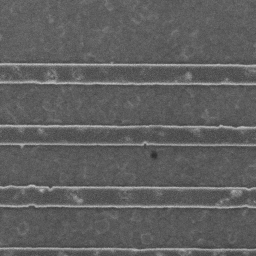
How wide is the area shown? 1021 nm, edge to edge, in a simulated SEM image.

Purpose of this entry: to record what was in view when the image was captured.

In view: one or a few lines or trenches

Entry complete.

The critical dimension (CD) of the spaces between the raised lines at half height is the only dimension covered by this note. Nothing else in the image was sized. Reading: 165 nm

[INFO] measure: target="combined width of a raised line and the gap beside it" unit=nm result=245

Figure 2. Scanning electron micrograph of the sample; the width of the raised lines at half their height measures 77.3 nm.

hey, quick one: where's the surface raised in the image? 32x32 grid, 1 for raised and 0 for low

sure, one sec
00000000000000000000000000000000
00000000000000000000000000000000
00000000000000000000000000000000
00000000000000000000000000000000
00000000000000000000000000000000
00000000000000000000000000000000
00000000000000000000000000000000
00000000000000000000000000000000
11111111111111111111111111111111
11111111111111111111111111111111
00000000001101111111000101110100
00000000000000000000000000000000
00000000000000000000000000000000
00000000000000000000000000000000
00000000000000000000000000000000
00000000000000000000000000000000
11111111111111111111111111111111
11111111111111111111111111111111
00000000000000000000000000000000
00000000000000000000000000000000
00000000000000000000000000000000
00000000000000000000000000000000
00000000000000000000000000000000
11111111111111111111111111101111
11111111111111111111111111111111
11111111111111111111111111111111
00000000000000000000000000000000
00000000000000000000000000000000
00000000000000000000000000000000
00000000000000000000000000000000
00000000000000000000000000000000
11111111111111111111111111111111